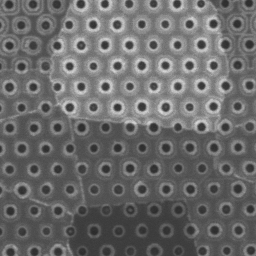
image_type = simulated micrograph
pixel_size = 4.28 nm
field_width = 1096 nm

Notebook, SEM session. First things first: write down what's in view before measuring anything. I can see a regular array of holes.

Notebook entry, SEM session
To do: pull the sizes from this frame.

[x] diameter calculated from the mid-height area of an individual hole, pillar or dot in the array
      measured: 9.44 px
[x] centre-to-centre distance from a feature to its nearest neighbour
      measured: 100 nanometres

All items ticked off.